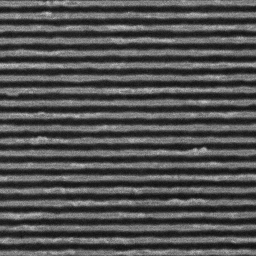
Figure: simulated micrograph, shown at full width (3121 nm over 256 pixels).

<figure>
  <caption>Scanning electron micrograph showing parallel lines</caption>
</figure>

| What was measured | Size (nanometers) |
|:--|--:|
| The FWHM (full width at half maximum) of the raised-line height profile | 64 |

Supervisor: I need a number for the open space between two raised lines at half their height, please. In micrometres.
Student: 0.0868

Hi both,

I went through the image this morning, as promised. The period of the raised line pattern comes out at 152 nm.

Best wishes